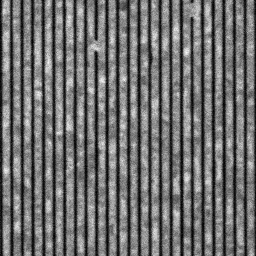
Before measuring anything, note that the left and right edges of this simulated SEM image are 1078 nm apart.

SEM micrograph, parallel lines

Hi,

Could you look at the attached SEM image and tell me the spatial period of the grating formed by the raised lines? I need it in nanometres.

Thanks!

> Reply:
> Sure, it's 44.7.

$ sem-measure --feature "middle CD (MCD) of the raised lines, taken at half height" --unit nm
28.9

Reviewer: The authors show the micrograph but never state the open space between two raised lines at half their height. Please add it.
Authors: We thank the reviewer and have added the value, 0.0147 micrometres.